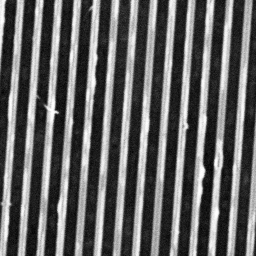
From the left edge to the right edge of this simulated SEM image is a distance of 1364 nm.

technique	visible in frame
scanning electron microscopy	parallel lines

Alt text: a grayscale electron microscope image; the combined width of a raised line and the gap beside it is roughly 101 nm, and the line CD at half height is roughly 31.2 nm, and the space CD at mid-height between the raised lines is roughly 67.1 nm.